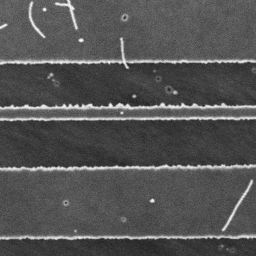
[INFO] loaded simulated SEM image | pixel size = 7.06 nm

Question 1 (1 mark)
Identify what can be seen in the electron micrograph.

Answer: lines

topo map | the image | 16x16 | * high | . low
****************
****************
****************
****************
................
................
................
*...............
................
................
..**************
****************
****************
****************
****************
................